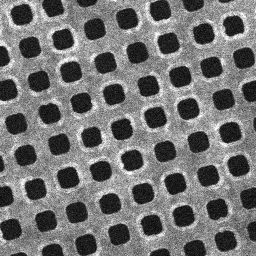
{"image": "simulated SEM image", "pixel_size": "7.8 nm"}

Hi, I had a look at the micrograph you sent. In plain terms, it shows a regular array of holes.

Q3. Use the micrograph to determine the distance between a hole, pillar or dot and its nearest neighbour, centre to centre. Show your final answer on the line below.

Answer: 0.255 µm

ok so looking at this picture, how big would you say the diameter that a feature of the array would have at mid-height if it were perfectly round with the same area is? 175 nanometers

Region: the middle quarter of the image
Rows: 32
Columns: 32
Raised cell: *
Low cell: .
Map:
....****.....*******************
....****.....**************....*
.....****.****************......
....***************....***......
..****************......***.....
***********....***......***...**
**********.....****.....********
***...****.....****....*********
**.....***.....****************.
**.....***.....**************...
**.....*********************....
**....***************....***....
********************.....****...
********************......***...
************.....****.....******
************.....****....*******
*****....***.....***************
****.....***.....***************
.***.....****...***************.
.****.....**************...****.
..***...***************.....***.
.****************.****......****
***************....****.....****
**************......***.....****
********...***......****..******
*******.....***.....************
...***......***...**************
...****.....***************...**
....***.....*************.....**
....*********************.....**
...***************....***......*
*****************.....****....**